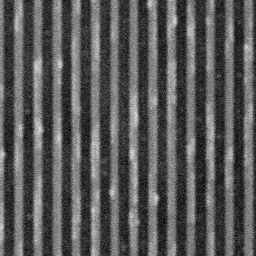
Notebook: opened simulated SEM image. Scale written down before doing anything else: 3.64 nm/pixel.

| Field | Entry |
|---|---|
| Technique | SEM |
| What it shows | parallel lines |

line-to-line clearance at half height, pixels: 11.9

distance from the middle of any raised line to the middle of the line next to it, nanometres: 69.7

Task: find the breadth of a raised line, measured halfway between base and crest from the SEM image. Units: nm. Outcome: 25.5